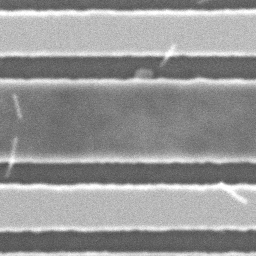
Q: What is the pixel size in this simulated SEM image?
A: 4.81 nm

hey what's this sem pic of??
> lines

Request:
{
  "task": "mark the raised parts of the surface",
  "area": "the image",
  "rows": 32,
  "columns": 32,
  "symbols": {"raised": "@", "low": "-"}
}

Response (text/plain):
--------------------------------
@-@@@@@@@@@@@@@--@@@@@@@@@@@@@@@
@@@@@@@@@@@@@@@@@@@@@@@@@@@@@@@@
@@@@@@@@@@@@@@@@@@@@@@@@@@@@@@@@
@@@@@@@@@@@@@@@@@@@@@@@@@@@@@@@@
@@@@@@@@@@@@@@@@@@@@@@@@@@@@@@@@
@@@@@@@@@@@@@@@@@@@@@@@@@@@@@@@@
--------------------------------
--------------------------------
--------------------------------
@@@@@@@@@@@@@@@@@@@@@@@@@@@@@@@@
@@@@@@@@@@@@@@@@@@@@@@@@@@@@@@@@
@@@@@@@@@@@@@@@@@@@@@@@@@@@@@@@@
@@@@@@@@@@@@@@@@@@@@@@@@@@@@@@@@
@@@@@@@@@@@@@@@@@@@@@@@@@@@@@@@@
@@@@@@@@@@@@@@@@@@@@@@@@@@@@@@@@
@@@@@@@@@@@@@@@@@@@@@@@@@@@@@@@@
@@@@@@@@@@@@@@@@@@@@@@@@@@@@@@@@
@@@@@@@@@@@@@@@@@@@@@@@@@@@@@@@@
@@@@@@@@@@@@@@@@@@@@@@@@@@@@@@@@
--------------------------------
--------------------------------
--------------------------------
@@@@@@@@@@@@@@@@@@@@@@@@@@@@@@@@
@@@@@@@@@@@@@@@@@@@@@@@@@@@@@@@@
@@@@@@@@@@@@@@@@@@@@@@@@@@@@@@@@
@@@@@@@@@@@@@@@@@@@@@@@@@@@@@@@@
@@@@@@@@@@@@@@@@@@@@@@@@@@@@@@@@
@@@@@@@@@@@@@@@@@@@@@@@@@@@@@@@@
--------------------------------
--------------------------------
--------------------------------